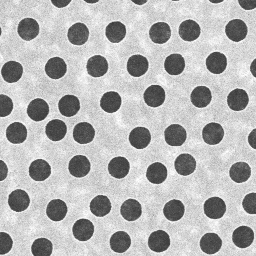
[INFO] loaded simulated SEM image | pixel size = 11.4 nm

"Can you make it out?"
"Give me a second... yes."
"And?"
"a regular array of holes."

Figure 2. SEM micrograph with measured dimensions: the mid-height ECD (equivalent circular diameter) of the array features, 0.255 µm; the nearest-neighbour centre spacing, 397 nanometers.